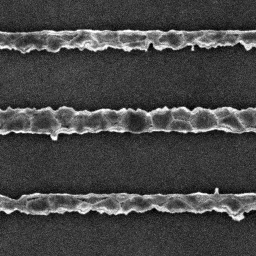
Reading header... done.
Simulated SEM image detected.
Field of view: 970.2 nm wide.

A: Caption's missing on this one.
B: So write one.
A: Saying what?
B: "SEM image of one or a few lines or trenches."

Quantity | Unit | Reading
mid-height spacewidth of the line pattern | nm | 238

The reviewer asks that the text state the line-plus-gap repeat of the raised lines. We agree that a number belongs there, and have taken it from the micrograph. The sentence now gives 82 pixels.